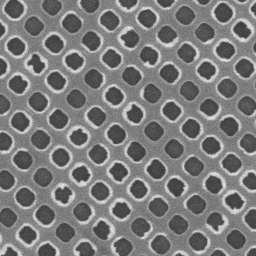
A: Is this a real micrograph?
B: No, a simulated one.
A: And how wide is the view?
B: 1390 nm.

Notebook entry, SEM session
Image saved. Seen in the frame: a regular array of holes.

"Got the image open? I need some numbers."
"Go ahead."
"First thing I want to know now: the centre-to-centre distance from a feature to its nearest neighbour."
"26.2 px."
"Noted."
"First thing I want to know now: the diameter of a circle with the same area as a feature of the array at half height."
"0.0991 micrometres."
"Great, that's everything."